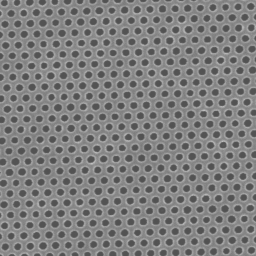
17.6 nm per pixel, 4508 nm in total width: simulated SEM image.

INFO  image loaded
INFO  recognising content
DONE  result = a regular array of holes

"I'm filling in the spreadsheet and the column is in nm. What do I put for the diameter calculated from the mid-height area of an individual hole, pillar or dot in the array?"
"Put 129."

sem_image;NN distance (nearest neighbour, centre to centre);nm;214